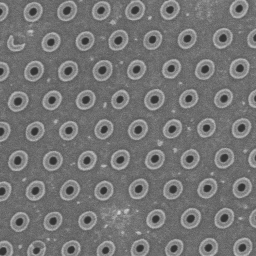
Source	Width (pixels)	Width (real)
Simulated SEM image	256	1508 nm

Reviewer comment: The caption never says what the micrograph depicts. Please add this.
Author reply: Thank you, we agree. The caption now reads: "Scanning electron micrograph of a regular array of ring-shaped raised bodies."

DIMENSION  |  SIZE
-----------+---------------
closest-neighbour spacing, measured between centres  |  198 nm